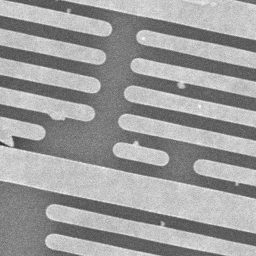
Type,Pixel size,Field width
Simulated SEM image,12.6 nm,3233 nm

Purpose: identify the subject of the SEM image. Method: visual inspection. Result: groups of lines, slits or small figures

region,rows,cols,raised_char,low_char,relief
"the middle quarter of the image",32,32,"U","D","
DDDDDDDDDDDDDDDDDUUUUUUUUUUUDDDD
DDDDDDDDDDDDDDDDDUUUUUUUUUUUUUUU
UUUDDDDDDDDDDDDDDDDUUUUUUUUUUUUU
UUUUUUUDDDDDDDDDDDDDDDDDUUUUUUUU
UUUUUUUUUDDDDDDDDDDDDDDDDDDDDUUU
UUUUUUUUUDDDDDDDDDDDDDDDDDDDDDDD
DDDDUUUUUDDDDDDUUUUUUUDDDDDDDDDD
DDDDDDDDDDDDDDDUUUUUUUUUUUUDDDDD
DDDDDDDDDDDDDDDUUUUUUUUUUUUUUUUU
UDDDDDDDDDDDDDDDDDUUUUUUUUUUUUUU
UUUUUUDDDDDDDDDDDDDDDDUUUUUUUUUU
UUUUUUUDDDDDDDDDDDDDDDDDDDDUUUUU
UUUUUUUUDDDDDDDDDDDDDDDDDDDDDDDD
UUUUUUUDDDDDDDUUUUUUDDDDDDDDDDDD
DDDDDDDDDDDDDDUUUUUUUUUUUDDDDDDD
DDDDDDDDDDDDDDUUUUUUUUUUUUUUUUDD
DDDDDDDDDDDDDDDDUUUUUUUUUUUUUUUU
DDDDDDDDDDDDDDDDDDDDDUUUUUUUUUUU
DDDDDDDDDDDDDDDDDDDDDDDDDDUUUUUU
DDDDDDDDDDDDDDDDDDDDDDDDDDDDDDDU
DDDDDDDDDDDDDUUUUUDDDDDDDDDDDDDD
DDDDDDDDDDDDUUUUUUUUUUUDDDDDDDDD
DDDDDDDDDDDDDUUUUUUUUUUUUUDDDDDD
DDDDDDDDDDDDDDDUUUUUUUUUUUDDDDDD
UUUUDDDDDDDDDDDDDDDDUUUUUUDDDDDD
UUUUUUUUDDDDDDDDDDDDDDDDDDDDDDDD
UUUUUUUUUUUUUDDDDDDDDDDDDDDDDDDD
UUUUUUUUUUUUUUUUUUDDDDDDDDDDDDDD
UUUUUUUUUUUUUUUUUUUUUUDDDDDDDDDD
UUUUUUUUUUUUUUUUUUUUUUUUUUUDDDDD
UUUUUUUUUUUUUUUUUUUUUUUUUUUUUUUU
UUUUUUUUUUUUUUUUUUUUUUUUUUUUUUUU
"